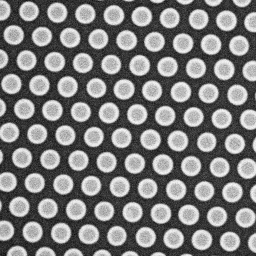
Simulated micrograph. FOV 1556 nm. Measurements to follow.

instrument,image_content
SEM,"an array of small figures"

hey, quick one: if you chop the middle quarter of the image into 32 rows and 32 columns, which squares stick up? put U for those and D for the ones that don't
DDUUUUUDDUUUUUDDUUUUUDDUUUUUDDDU
DDDUUUDDDDUUUUDDDUUUUDDDUUUUDDDU
DDDDDDDDDDDDDDDDDDUUDDDDUUUUDDDU
UUDDDDDDDDDDDDDDDDDDDDDDDDDDDDDD
UUUDDDUUUUDDDUUUUDDDDUUDDDDDDDDD
UUUDDDUUUUDDDUUUUDDDUUUUDDDUUUUD
UUUDDDUUUUDDDUUUUDDDUUUUDDDUUUUU
UUUDDDUUUUDDDUUUUDDDUUUUDDDUUUUU
DDDDDDDDDDDDDDUUDDDDUUUUDDDUUUUD
DDDDDDDDDDDDDDDDDDDDDDDDDDDDDDDD
DDUUUUDDDUUUUDDDDUUUDDDDDDDDDDDD
DDUUUUUDDUUUUUDDUUUUDDDUUUUDDDDU
DDUUUUUDDUUUUUDDUUUUUDDUUUUUDDUU
DDUUUUDDDUUUUDDDUUUUUDDUUUUUDDUU
DDDDDDDDDDUUDDDDDUUUDDDUUUUDDDUU
DDDDDDDDDDDDDDDDDDDDDDDDDDDDDDDD
UUDDDDUUUDDDDUUUDDDDDDDDDDDDDDDD
UUUDDUUUUUDDUUUUUDDDUUUUDDDUUUDD
UUUDDUUUUUDDUUUUUDDUUUUUDDUUUUUD
UUDDDUUUUDDDUUUUUDDUUUUUDDUUUUUD
DDDDDDDUDDDDDUUUDDDDUUUUDDUUUUUD
DDDDDDDDDDDDDDDDDDDDDDDDDDDUUUDD
DDUUUDDDDUUUDDDDDDDDDDDDDDDDDDDD
DUUUUUDDDUUUUDDDUUUUDDDUUUDDDDDU
DUUUUUDDUUUUUDDUUUUUDDUUUUUDDDUU
DDUUUUDDDUUUUDDUUUUUDDUUUUUDDUUU
DDDUDDDDDUUUDDDDUUUUDDDUUUUDDDUU
DDDDDDDDDDDDDDDDDDDDDDDDUUDDDDUU
UUDDDUUUDDDDDUUDDDDDDDDDDDDDDDDD
UUDDDUUUUDDDUUUUDDDUUUUDDDDUUUDD
UUDDUUUUUDDDUUUUDDDUUUUDDDUUUUDD
UUDDDUUUUDDDUUUUDDDUUUUDDDUUUUDD